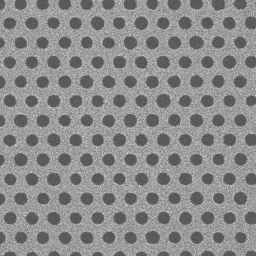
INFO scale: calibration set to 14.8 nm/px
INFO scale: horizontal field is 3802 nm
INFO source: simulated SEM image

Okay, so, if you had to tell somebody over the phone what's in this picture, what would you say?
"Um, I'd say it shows a regular array of holes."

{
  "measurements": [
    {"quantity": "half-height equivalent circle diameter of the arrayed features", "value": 192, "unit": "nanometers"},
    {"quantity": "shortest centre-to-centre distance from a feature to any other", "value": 0.324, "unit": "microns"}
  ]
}